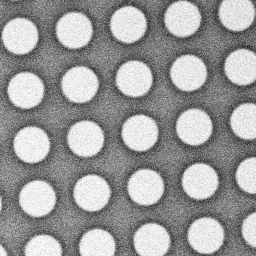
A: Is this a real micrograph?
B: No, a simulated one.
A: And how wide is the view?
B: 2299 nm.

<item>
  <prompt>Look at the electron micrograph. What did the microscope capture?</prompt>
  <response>an array of small figures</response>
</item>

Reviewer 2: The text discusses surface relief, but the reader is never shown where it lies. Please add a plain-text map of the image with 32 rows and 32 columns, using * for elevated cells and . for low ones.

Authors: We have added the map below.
......................**....****
...............***...****..*****
..*.....***...****...****...****
.***...****...****...****...***.
*****..****...****....*.........
.****...***.....................
..*..........................**.
......................***...****
.........**....****..*****..****
..**....****...****..*****..****
.****...****...****...***.....*.
.****...****...***..............
.****....**.....................
..............................**
.................*.....***...***
..........**....***...****...***
..***....****..*****..****...***
..****...****..*****...***......
..****...****...***.............
..****....*.....................
..............................**
.................**....****...**
..........***...****...****...**
...***...*****..****...****...**
...****..*****..****....**......
...****...***.....*.............
...***..........................
.........................**....*
..................**....****..**
.....*....****...****...****..**
....***...****...****...****...*
*..*****..****...****....**.....